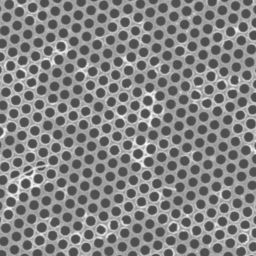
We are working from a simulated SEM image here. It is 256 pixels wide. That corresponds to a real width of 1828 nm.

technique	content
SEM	a regular array of holes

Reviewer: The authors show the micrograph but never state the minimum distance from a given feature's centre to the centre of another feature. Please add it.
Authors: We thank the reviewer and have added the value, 0.0935 micrometres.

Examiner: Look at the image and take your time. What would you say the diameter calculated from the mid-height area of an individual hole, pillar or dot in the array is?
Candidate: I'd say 71.6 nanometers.